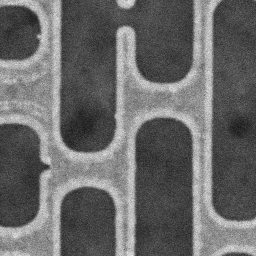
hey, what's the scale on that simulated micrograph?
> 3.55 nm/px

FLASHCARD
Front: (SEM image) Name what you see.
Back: one or a few lines or trenches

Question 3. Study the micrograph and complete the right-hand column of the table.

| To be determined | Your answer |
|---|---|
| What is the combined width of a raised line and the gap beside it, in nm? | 269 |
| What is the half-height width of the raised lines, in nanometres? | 46.6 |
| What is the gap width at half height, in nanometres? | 224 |